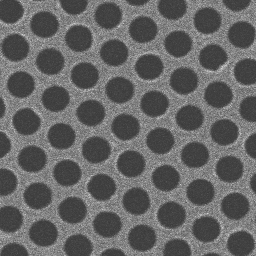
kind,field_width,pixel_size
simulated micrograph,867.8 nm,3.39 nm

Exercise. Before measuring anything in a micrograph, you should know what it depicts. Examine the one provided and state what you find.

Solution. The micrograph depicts a regular array of holes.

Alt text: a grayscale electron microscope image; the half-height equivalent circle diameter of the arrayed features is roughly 0.0918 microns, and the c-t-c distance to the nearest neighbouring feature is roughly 0.126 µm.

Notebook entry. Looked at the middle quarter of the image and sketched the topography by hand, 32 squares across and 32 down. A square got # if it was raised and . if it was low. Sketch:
###.....####.#####.......#######
##......##########.......###....
##.......#########......###.....
##.......###...####....####.....
##......###......#########......
###....####......##########.....
##########.......##########.....
.##########......###.....####..#
.##########......###......######
.####....####..####.......######
.###......#########.......####..
###.......#########.......###...
###.......#####.####.....###....
###.......###.....##########....
####.....###.......#########....
..####.#####.......##########...
..##########.......###....####..
...#########......###......#####
...####...####...####......#####
...##......##########......#####
..###......##########......####.
#####.......##########.....###..
#####......###.....####..####...
#####......###......#########...
...####..####.......##########..
....#########.......####...####.
....##########......###.....####
....#####.#####....###.......###
....###.....##########.......###
...###.......#########.......###
.#####.......##########.....###.
######.......###....####...####.